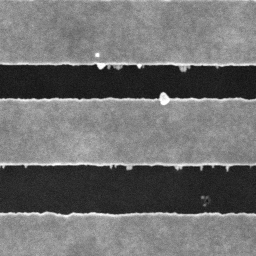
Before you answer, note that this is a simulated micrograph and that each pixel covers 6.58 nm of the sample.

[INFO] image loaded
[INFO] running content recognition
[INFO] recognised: lines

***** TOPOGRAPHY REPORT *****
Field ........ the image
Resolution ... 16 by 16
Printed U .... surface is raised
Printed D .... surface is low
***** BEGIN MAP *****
UUUUUUUUUUUUUUUU
UUUUUUUUUUUUUUUU
UUUUUUUUUUUUUUUU
UUUUUUUUUUUUUUUU
DDDDDDDDDDDDDDDD
DDDDDDDDDDDDDDDD
UUUUUUUUUUUUUUUU
UUUUUUUUUUUUUUUU
UUUUUUUUUUUUUUUU
UUUUUUUUUUUUUUUU
DDDDDDDDDDDDDDDD
DDDDDDDDDDDDDDDD
DDDDDDDDDDDDDDDD
UUUUUUUUUUUUUUUU
UUUUUUUUUUUUUUUU
UUUUUUUUUUUUUUUU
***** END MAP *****